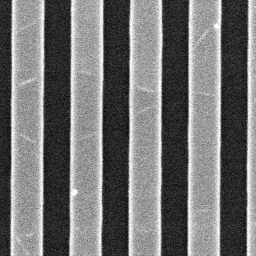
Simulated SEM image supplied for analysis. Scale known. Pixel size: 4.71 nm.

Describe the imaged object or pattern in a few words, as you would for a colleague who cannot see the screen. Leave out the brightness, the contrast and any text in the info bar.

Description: wiring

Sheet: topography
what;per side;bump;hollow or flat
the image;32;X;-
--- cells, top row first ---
--XXX----XXXX---XXXX----XXXX---X
--XXX----XXXX---XXXX----XXXX---X
--XXX----XXXX---XXXX----XXX----X
--XXX----XXXX---XXXX----XXX----X
--XXX----XXXX---XXXX----XXX----X
--XXX----XXXX---XXXX----XXX----X
--XXX----XXXX---XXXX----XXX----X
--XXX----XXXX---XXXX----XXX----X
--XXX----XXXX---XXXX----XXX----X
--XXX----XXXX---XXXX----XXX----X
--XXX----XXXX---XXXX----XXX----X
--XXX----XXXX---XXXX----XXX----X
-XXXX----XXXX---XXXX----XXX----X
-XXXX----XXXX---XXXX----XXX----X
-XXXX----XXXX---XXXX----XXX----X
-XXXX----XXXX---XXXX----XXX----X
-XXXX----XXXX---XXXX----XXX----X
-XXXX----XXXX---XXXX----XXX----X
-XXXX----XXXX---XXXX----XXX----X
-XXXX----XXXX---XXXX----XXX----X
-XXXX----XXXX---XXXX----XXX----X
-XXXX----XXXX---XXXX----XXX----X
-XXXX----XXXX---XXXX----XXX----X
-XXXX----XXXX---XXXX----XXX----X
-XXXX----XXXX---XXXX----XXX----X
-XXXX----XXXX---XXXX----XXX----X
-XXXX----XXXX---XXXX----XXX----X
-XXXX----XXXX---XXXX----XXX----X
-XXXX----XXXX---XXXX----XXX----X
-XXXX----XXXX---XXXX----XXX----X
-XXXX----XXXX---XXXX----XXX----X
-XXXX----XXXX---XXXX----XXX----X